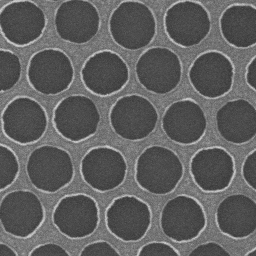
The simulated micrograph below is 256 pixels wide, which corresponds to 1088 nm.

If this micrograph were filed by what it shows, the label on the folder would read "a regular array of holes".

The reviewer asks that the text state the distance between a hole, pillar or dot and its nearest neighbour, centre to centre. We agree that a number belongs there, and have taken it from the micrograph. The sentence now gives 225 nm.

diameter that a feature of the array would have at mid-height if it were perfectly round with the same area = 44.6 px